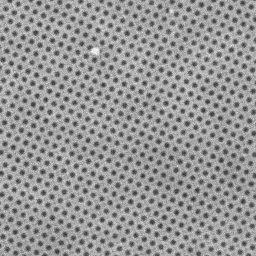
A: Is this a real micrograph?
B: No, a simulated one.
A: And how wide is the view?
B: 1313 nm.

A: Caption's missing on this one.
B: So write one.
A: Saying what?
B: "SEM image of a regular array of holes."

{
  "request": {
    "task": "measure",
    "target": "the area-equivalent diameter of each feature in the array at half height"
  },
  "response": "31.2 nanometers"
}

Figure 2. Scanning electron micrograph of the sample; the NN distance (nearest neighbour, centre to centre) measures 46.5 nm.